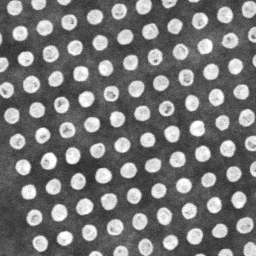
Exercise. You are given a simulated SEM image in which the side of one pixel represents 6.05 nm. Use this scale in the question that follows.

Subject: a regular array of raised bodies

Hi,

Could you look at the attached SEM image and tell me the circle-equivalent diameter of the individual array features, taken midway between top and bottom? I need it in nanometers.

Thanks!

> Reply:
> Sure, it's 87.9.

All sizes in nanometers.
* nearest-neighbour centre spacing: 152